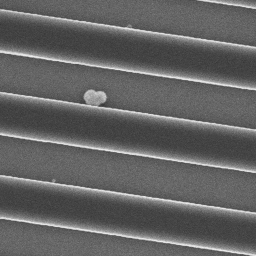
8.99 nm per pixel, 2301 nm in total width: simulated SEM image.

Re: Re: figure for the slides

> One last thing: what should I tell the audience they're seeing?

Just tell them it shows lines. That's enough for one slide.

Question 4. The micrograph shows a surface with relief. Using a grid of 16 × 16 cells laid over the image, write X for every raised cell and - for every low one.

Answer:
----------------
XXXXXX----------
XXXXXXXXXXXXX---
--XXXXXXXXXXXXXX
--------XXXXXXXX
---------------X
XXXXXX----------
XXXXXXXXXXXX----
-XXXXXXXXXXXXXXX
-------XXXXXXXXX
--------------XX
XXXX------------
XXXXXXXXXX------
XXXXXXXXXXXXXXXX
------XXXXXXXXXX
-------------XXX